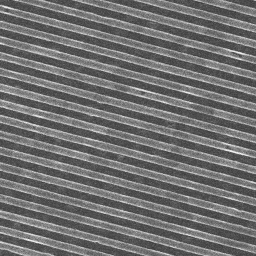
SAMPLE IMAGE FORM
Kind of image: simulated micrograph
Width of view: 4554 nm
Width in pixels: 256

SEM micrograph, parallel lines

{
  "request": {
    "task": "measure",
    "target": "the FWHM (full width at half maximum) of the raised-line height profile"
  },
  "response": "131 nm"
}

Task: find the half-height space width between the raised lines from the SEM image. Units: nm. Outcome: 140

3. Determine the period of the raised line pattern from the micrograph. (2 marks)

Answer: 15.3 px